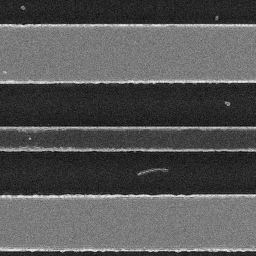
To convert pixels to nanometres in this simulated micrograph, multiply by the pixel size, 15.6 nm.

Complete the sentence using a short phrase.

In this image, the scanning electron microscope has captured lines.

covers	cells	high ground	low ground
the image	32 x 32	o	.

................................
................................
................................
oooooooooooooooooooooooooooooooo
oooooooooooooooooooooooooooooooo
oooooooooooooooooooooooooooooooo
oooooooooooooooooooooooooooooooo
oooooooooooooooooooooooooooooooo
oooooooooooooooooooooooooooooooo
oooooooooooooooooooooooooooooooo
................................
................................
................................
................................
................................
................................
oooooooooooooooooooooooooooooooo
oooooooooooooooooooooooooooooooo
oooooooooooooooooooooooooooooooo
................................
................................
................................
................................
................................
..............o...o.oo..oooooooo
oooooooooooooooooooooooooooooooo
oooooooooooooooooooooooooooooooo
oooooooooooooooooooooooooooooooo
oooooooooooooooooooooooooooooooo
oooooooooooooooooooooooooooooooo
oooooooooooooooooooooooooooooooo
................................